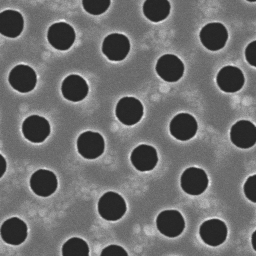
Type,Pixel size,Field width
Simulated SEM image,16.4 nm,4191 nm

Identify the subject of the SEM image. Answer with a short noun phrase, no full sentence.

a regular array of holes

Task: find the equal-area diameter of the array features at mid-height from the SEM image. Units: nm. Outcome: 464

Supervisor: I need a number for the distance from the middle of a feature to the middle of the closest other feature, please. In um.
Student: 0.843